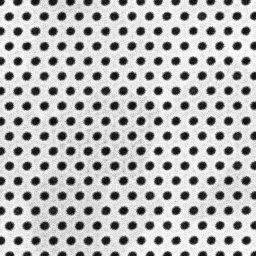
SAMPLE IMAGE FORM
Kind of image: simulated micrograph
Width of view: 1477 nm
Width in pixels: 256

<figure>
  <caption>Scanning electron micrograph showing a regular array of holes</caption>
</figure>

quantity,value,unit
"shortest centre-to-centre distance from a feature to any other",17.1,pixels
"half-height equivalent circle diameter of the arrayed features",57.1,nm